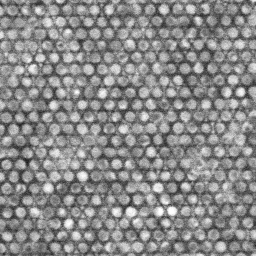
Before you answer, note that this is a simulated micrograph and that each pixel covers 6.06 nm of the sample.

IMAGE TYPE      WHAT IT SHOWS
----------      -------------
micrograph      a regular array of raised bodies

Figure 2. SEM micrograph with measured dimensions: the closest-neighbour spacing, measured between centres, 80.7 nanometres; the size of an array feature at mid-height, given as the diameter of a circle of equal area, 53.4 nm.